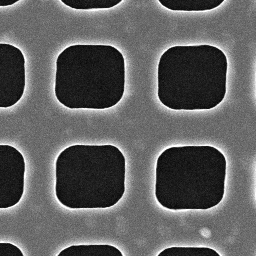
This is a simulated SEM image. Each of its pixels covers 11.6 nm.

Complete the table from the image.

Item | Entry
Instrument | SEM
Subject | holes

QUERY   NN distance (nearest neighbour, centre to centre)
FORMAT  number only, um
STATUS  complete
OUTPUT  1.16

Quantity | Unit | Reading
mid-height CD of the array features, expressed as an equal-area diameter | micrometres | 0.834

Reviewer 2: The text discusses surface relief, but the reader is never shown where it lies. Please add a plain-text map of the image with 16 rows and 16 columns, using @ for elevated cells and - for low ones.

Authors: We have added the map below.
@@@@@--@@@---@@@
@@@@@@@@@@@@@@@@
@@@@@@@@@@@@@@@@
-@@@----@@----@@
--@-----@@----@@
--@-----@@----@@
-@@@---@@@----@@
@@@@@@@@@@@@@@@@
@@@@@@@@@@@@@@@@
-@@@----@@----@@
--@-----@@----@@
--@-----@@----@@
-@@@---@@@----@@
@@@@@@@@@@@@@@@@
@@@@@@@@@@@@@@@@
-@@@---@@@@--@@@